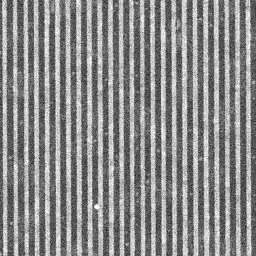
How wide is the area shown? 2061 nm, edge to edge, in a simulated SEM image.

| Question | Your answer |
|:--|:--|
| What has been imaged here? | parallel lines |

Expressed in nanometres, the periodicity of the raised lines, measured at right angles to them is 85.2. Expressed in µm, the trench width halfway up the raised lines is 0.0533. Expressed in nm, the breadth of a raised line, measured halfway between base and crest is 32.2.